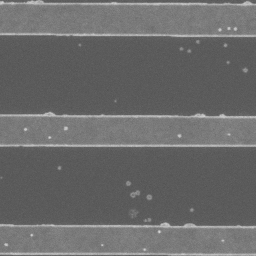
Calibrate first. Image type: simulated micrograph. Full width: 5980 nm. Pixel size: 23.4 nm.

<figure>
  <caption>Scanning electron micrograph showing lines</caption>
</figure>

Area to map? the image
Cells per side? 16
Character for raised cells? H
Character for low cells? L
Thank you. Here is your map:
HHHHHHHHHHHHHHHH
HHHHHHHHHHHHHHHH
LLLLLLLLLLLLLLLL
LLLLLLLLLLLLLLLL
LLLLLLLLLLLLLLLL
LLLLLLLLLLLLLLLL
LLLLLLLLLLLLLLLL
HHHHHHHHHHHHHHHH
HHHHHHHHHHHHHHHH
LLLLLLLLLLLLLLLL
LLLLLLLLLLLLLLLL
LLLLLLLLLLLLLLLL
LLLLLLLLLLLLLLLL
LLLLLLLLLLLLLLLL
HHHHHHHHHHHHHHHH
HHHHHHHHHHHHHHHH